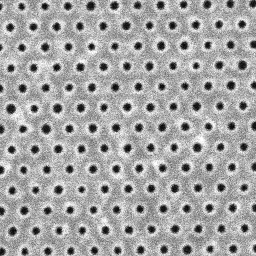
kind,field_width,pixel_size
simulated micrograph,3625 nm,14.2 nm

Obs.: a regular array of holes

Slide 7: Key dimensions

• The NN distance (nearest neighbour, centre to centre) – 325 nanometres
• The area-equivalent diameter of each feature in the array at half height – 129 nm